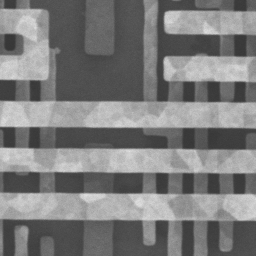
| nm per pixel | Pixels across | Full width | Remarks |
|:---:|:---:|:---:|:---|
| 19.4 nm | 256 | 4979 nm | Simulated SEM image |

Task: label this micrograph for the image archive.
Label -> wiring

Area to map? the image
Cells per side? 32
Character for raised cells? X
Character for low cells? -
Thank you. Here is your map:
--------------------------------
XXXXXX---------------XXXXXXXXX--
XXXXXX---------------XXXXXXXXXXX
XXXXXX---------------XXXXXXXXXXX
---XXX--------------------------
---XXX--------------------------
---XXX--------------------------
XXXXXX---------------XXXXXXXXXXX
XXXXXX---------------XXXXXXXXXXX
XXXXXX---------------XXXXXXXXXXX
--------------------------------
--------------------------------
--------------------------------
XXXXXXXXXXXXXXXXXXXXXXXXXXXXXXXX
XXXXXXXXXXXXXXXXXXXXXXXXXXXXXXXX
XXXXXXXXXXXXXXXXXXXXXXXXXXXXXXXX
--------------------------------
--------------------------------
--------------------------------
XXXXXXXXXXXXXXXXXXXXXXXXXXXXXXXX
XXXXXXXXXXXXXXXXXXXXXXXXXXXXXXXX
-----------------------XXXXXXXXX
--------------------------------
--------------------------------
XXXXXXXXXXXXXXXXXXXXXXXXXXXXXXXX
XXXXXXXXXXXXXXXXXXXXXXXXXXXXXXXX
XXXXXXXXXXXXXXXXXXXXXXXXXXXXXXXX
--------------------------------
--------------------------------
--------------------------------
--------------------------------
--------------------------------